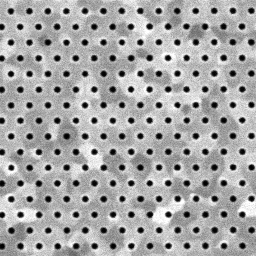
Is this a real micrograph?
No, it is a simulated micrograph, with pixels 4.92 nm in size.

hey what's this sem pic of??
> a regular array of holes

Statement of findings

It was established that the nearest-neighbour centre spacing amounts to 17.8 px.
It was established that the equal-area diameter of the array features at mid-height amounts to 31.9 nanometers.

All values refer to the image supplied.